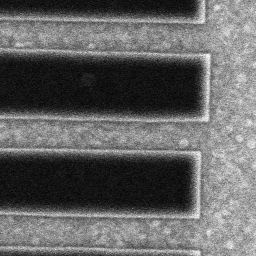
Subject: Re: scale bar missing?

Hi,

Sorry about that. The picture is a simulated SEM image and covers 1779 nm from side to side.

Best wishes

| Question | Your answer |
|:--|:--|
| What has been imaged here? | one or a few lines or trenches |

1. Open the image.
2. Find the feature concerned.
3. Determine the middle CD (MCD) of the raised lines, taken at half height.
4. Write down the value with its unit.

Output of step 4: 464 nanometres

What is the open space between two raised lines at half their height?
210 nm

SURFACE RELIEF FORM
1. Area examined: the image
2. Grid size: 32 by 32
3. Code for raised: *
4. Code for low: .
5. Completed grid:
**************************......
**************************......
....**********************......
................................
................................
................................
***********.....................
**************************......
**************************......
**************************......
**************************......
**************************......
**************************......
**************************......
**************************......
................................
................................
................................
................................
*************************.......
*************************.......
*************************.......
*************************.......
*************************.......
*************************.......
*************************.......
*************************.......
................................
................................
................................
................................
*************************.......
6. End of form